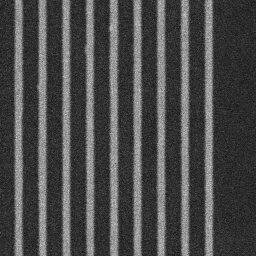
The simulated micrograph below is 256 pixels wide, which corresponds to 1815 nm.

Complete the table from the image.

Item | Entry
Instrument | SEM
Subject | parallel lines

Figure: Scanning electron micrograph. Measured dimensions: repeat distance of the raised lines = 168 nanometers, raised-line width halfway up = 47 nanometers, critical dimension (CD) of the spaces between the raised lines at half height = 121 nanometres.